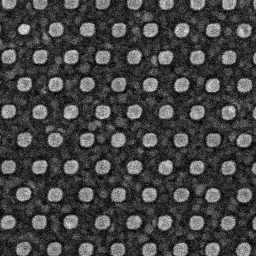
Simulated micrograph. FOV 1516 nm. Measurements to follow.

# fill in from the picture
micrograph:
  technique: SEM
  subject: a regular array of raised bodies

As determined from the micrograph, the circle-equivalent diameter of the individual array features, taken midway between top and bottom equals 82.9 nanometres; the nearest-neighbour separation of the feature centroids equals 31.2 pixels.